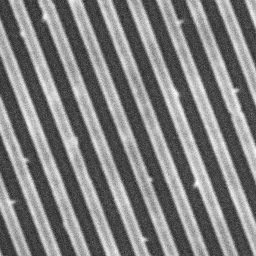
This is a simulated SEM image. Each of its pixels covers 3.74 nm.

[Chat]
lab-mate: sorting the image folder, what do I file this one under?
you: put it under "parallel lines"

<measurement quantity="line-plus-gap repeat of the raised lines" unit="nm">103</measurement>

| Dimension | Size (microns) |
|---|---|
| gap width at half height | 0.0616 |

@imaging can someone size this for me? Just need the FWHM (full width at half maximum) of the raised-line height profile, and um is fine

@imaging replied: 0.0419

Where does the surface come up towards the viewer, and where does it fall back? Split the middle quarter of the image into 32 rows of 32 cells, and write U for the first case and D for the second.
UUUDDDDUUUUDDDDUUUDDDDUUUDDDDDUU
DUUUDDDDUUUDDDDUUUDDDDDUUUDDDDUU
DUUUDDDDUUUDDDDDUUUDDDDUUUDDDDUU
DUUUDDDDDUUUDDDDUUUDDDDUUUUDDDDU
DDUUUDDDDUUUDDDDUUUUDDDDUUUDDDDU
DDUUUDDDDUUUDDDDDUUUDDDDUUUDDDDD
DDUUUDDDDDUUUDDDDUUUDDDDUUUUDDDD
DDDUUUDDDDUUUDDDDUUUUDDDDUUUDDDD
DDDUUUDDDDUUUUDDDDUUUDDDDUUUDDDD
DDDDUUUDDDDUUUDDDDUUUDDDDDUUUDDD
DDDDUUUDDDDUUUDDDDDUUUDDDDUUUDDD
DDDDUUUDDDDDUUUDDDDUUUDDDDUUUUDD
DDDDDUUUDDDDUUUDDDDUUUUDDDDUUUDD
UDDDDUUUDDDDUUUDDDDDUUUDDDDUUUDD
UDDDDDUUUDDDDUUUDDDDUUUDDDDDUUUD
UDDDDDUUUDDDDUUUDDDDDUUUDDDDUUUD
UUDDDDUUUDDDDUUUUDDDDUUUDDDDUUUD
UUDDDDDUUUDDDDUUUDDDDUUUDDDDDUUU
UUUDDDDUUUDDDDUUUDDDDDUUUDDDDUUU
UUUDDDDUUUDDDDDUUUDDDDUUUDDDDUUU
UUUDDDDDUUUDDDDUUUDDDDUUUUDDDDUU
DUUUDDDDUUUDDDDUUUDDDDDUUUDDDDUU
DUUUDDDDDUUUDDDDUUUDDDDUUUDDDDDU
DDUUUDDDDUUUDDDDUUUDDDDDUUUDDDDU
DDUUUDDDDUUUDDDDDUUUDDDDUUUDDDDU
DDUUUDDDDDUUUDDDDUUUDDDDUUUUDDDD
DDDUUDDDDDUUUDDDDUUUDDDDDUUUDDDD
DDDUUUDDDDDUUDDDDDUUUDDDDUUUDDDD
DDDUUUDDDDDUUUDDDDUUUDDDDUUUUDDD
DDDDUUUDDDDUUUDDDDUUUUDDDDUUUDDD
DDDDUUUDDDDUUUUDDDDUUUDDDDUUUDDD
DDDDDUUUDDDDUUUDDDDUUUDDDDDUUUDD